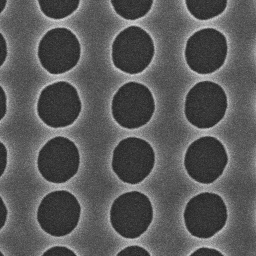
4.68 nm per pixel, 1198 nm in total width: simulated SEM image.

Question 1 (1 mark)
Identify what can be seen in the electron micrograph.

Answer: a regular array of holes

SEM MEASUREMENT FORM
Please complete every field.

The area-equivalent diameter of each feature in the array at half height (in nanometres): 212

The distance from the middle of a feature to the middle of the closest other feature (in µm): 0.253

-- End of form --